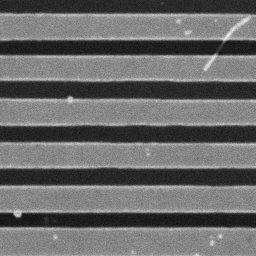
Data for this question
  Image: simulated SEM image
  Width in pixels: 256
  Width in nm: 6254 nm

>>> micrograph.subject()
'lines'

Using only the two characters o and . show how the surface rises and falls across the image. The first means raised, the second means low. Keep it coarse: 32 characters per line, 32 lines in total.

................................
................................
oooooooooooooooooooooooooooooooo
oooooooooooooooooooooooooooooooo
oooooooooooooooooooooooooooooooo
................................
................................
oooooooooooooooooooooooooooooooo
oooooooooooooooooooooooooooooooo
oooooooooooooooooooooooooooooooo
................................
................................
oooooooooooooooooooo............
oooooooooooooooooooooooooooooooo
oooooooooooooooooooooooooooooooo
oooooooooooooooooooooooooooooooo
................................
................................
oooooooooooooooooooooooooooooooo
oooooooooooooooooooooooooooooooo
oooooooooooooooooooooooooooooooo
................................
................................
oooooooooooooooooooooooooooooooo
oooooooooooooooooooooooooooooooo
oooooooooooooooooooooooooooooooo
.oo.............................
................................
................................
oooooooooooooooooooooooooooooooo
oooooooooooooooooooooooooooooooo
oooooooooooooooooooooooooooooooo